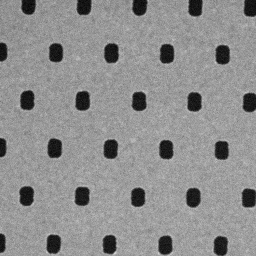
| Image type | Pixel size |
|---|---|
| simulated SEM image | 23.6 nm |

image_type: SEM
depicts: a regular array of holes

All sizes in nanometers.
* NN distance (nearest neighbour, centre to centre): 1300